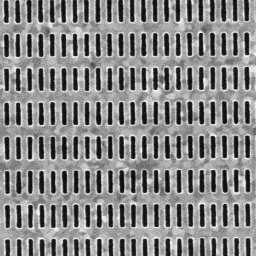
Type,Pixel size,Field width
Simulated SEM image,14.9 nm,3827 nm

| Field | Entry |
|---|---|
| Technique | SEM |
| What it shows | a regular array of holes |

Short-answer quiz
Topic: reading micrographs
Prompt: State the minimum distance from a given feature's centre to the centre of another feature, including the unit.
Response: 11.3 pixels